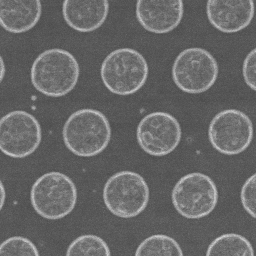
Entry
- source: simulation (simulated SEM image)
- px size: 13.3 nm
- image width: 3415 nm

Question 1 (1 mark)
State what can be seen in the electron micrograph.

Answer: a regular array of raised bodies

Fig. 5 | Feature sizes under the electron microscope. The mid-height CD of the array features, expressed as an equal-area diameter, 0.587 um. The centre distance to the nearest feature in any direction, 918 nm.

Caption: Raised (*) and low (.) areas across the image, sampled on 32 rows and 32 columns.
*****...*****....******...******
*****...*****....******...******
*****...*****.....****....*****.
.***.....***......***......***..
................................
................................
......**......***......***......
.....****....*****....*****....*
....******...*****....*****....*
....******...*****....*****....*
....*****....*****....****.....*
.....***......***...............
................................
................................
.***.....****......**......****.
*****...*****.....****....*****.
*****...******...*****....*****.
*****...******...*****....*****.
****.....****.....****.....****.
................................
................................
................................
.....****.....****.....***.....*
....*****....*****....*****...**
....*****....*****....*****...**
....*****....*****....*****....*
.....****.....***......***.....*
................................
................................
...................*........**..
****.....****.....****.....****.
*****....*****...******...******